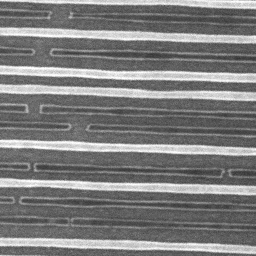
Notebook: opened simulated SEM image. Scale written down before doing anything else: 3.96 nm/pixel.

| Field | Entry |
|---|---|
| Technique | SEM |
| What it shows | parallel lines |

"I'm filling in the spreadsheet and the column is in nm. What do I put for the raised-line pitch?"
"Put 75.1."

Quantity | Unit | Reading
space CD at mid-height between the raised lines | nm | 46.6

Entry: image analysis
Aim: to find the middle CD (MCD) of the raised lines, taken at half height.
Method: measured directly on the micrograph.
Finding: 0.0267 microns